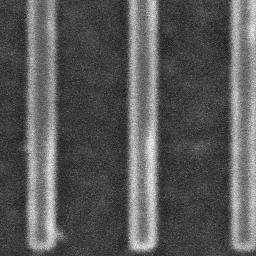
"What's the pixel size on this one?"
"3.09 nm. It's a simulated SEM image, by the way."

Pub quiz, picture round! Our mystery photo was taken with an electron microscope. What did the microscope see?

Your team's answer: one or a few lines or trenches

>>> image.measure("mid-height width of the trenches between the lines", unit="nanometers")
247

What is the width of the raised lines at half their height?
68.4 nanometres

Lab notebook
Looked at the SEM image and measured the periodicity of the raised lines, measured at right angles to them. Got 314 nm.